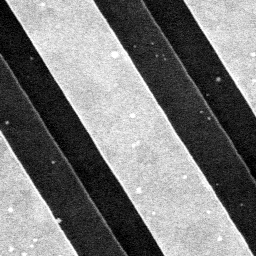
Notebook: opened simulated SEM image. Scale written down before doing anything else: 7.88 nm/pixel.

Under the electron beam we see lines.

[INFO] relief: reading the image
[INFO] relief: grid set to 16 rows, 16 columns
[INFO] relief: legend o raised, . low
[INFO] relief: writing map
.ooooo......oooo
.oooooo.....oooo
..ooooo......ooo
...ooooo......oo
...oooooo.....oo
....ooooo......o
....oooooo......
.....ooooo......
......ooooo.....
o.....oooooo....
o......ooooo....
oo......ooooo...
ooo.....oooooo..
ooo......ooooo..
oooo.....oooooo.
ooooo.....oooooo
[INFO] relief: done